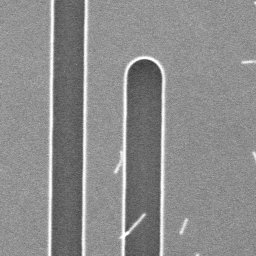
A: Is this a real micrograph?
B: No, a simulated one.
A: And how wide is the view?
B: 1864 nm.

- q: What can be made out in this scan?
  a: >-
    groups of lines, slits or small figures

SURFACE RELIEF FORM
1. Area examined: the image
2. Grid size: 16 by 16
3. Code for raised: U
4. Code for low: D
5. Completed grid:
UUUDDUUUUUUUUUUU
UUUDDUUUUUUUUUUU
UUUDDUUUUUUUUUUU
UUUDDUUUUUUUUUUU
UUUDDUUUDDUUUUUU
UUUDDUUUDDUUUUUU
UUUDDUUUDDUUUUUU
UUUDDUUUDDUUUUUU
UUUDDUUUDDUUUUUU
UUUDDUUUDDUUUUUU
UUUDDUUUDDUUUUUU
UUUDDUUUDDUUUUUU
UUUDDUUUDDUUUUUU
UUUDDUUUDDUUUUUU
UUUDDUUUDDUUUUUU
UUUDDUUUDDUUUUUU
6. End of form